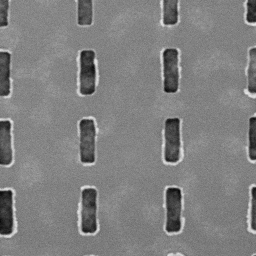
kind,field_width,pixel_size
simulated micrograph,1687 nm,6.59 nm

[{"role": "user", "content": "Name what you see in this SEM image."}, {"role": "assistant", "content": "holes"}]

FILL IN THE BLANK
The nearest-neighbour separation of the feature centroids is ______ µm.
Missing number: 0.455